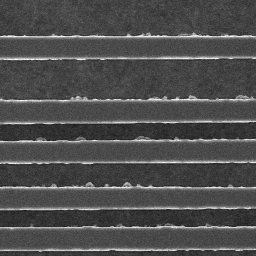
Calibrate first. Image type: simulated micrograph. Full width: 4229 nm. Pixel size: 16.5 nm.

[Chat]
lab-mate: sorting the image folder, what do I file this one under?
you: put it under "lines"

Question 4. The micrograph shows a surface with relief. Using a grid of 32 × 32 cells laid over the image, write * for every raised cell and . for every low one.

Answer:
................................
................................
................................
................................
................................
********************************
********************************
................................
................................
................................
................................
................................
...........**.*.**********.*****
********************************
********************************
................................
................................
..........................***.**
********************************
********************************
................................
................................
................................
*****.*****..***********.***..*.
********************************
********************************
................................
................................
********************************
********************************
********************************
................................